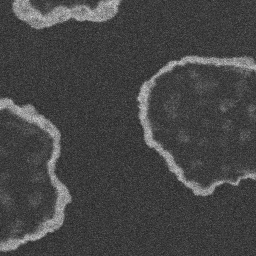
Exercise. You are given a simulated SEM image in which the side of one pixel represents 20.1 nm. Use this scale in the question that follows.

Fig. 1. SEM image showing raised bodies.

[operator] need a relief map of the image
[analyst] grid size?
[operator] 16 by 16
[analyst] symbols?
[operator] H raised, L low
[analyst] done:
LHHHHHHLLLLLLLLL
LLLLLLLLLLLLLLLL
LLLLLLLLLLLLLLLL
LLLLLLLLLLLLLLLL
LLLLLLLLLLHHHHHH
LLLLLLLLLHHHHHHH
HLLLLLLLLHHHHHHH
HHLLLLLLLHHHHHHH
HHHLLLLLLHHHHHHH
HHHHLLLLLLHHHHHH
HHHLLLLLLLLHHHHH
HHHLLLLLLLLLHHLL
HHHHLLLLLLLLLLLL
HHHHLLLLLLLLLLLL
HHHLLLLLLLLLLLLL
LLLLLLLLLLLLLLLL